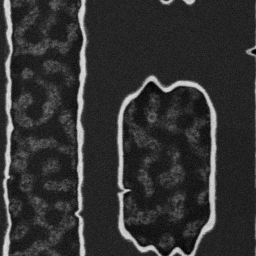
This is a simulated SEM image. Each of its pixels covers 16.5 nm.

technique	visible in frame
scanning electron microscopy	one or a few lines or trenches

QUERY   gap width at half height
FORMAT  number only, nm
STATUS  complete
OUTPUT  1210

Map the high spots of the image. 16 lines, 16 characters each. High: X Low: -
-----XXXXXXXXXXX
X----XXXXXXXXXXX
X----XXXXXXXXXXX
X----XXXXXXXXXXX
X----XXXXXXXXXXX
X----XXXX-X-XXXX
X----XXX-----XXX
X----XXX-----XXX
X----XX------XXX
X----XXX-----XXX
-----XXX-----XXX
-----XXX-----XXX
-----XXX-----XXX
X----XXX-----XXX
X----XXX-----XXX
-----XXXX---XXXX